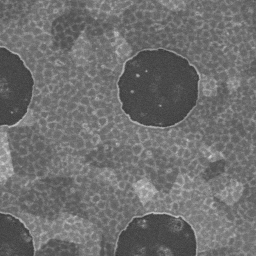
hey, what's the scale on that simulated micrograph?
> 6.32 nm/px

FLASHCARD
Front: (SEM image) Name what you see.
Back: holes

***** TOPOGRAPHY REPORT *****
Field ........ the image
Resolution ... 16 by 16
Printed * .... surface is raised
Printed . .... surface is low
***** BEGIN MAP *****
****************
****************
****************
.*******...*****
..******....****
..*****.....****
..******....****
.*******...*****
****************
****************
****************
****************
****************
.********..*****
..******....****
..*****.....****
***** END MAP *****